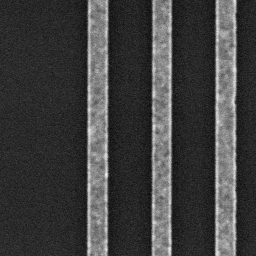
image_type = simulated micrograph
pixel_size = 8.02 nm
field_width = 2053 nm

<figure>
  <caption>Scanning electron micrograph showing one or a few lines or trenches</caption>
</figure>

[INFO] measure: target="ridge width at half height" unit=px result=17.6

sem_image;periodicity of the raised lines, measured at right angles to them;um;0.513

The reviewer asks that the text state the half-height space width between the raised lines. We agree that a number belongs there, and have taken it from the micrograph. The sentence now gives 370 nm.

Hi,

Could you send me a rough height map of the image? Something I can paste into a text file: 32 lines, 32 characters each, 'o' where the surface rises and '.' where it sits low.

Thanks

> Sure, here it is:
...........oo......oo......oo...
...........oo......oo......oo...
...........oo......oo......oo...
...........oo......oo......oo...
...........oo......oo......oo...
...........oo......oo......oo...
...........oo......oo......oo...
...........oo......oo......oo...
...........oo......oo......oo...
...........oo......oo......oo...
...........oo......oo......oo...
...........oo......oo......oo...
...........oo......oo......oo...
...........oo......oo......oo...
...........oo......oo......oo...
...........oo......oo......oo...
...........oo......oo......oo...
...........oo......oo......oo...
...........oo......oo......oo...
...........oo......oo......oo...
...........oo......oo......oo...
...........oo......oo......oo...
...........oo......oo......oo...
...........oo......oo......oo...
...........oo......oo......oo...
...........oo......oo......oo...
...........oo......oo......oo...
...........oo......oo......oo...
...........oo......oo......oo...
...........oo......oo......oo...
...........oo......oo......oo...
...........oo......oo......oo...